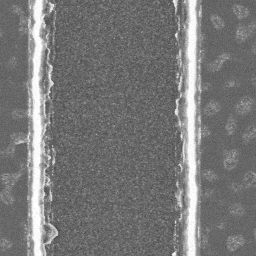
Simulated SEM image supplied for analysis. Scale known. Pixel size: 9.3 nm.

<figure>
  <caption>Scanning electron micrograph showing one or a few lines or trenches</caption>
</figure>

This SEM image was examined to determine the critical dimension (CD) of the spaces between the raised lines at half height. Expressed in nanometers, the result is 1440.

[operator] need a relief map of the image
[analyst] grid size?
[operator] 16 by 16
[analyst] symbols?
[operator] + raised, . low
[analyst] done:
++..........++++
++..........++++
++..........++++
++..........++++
++..........++++
++..........++++
++..........++++
++..........++++
++..........++++
++..........++++
++..........++++
++..........++++
++..........++++
++..........++++
++..........++++
++..........++++